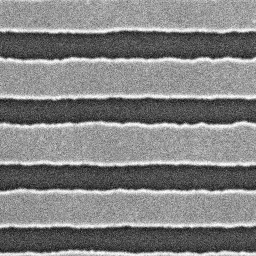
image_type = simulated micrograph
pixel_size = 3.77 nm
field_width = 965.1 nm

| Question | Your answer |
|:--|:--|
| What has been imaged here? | lines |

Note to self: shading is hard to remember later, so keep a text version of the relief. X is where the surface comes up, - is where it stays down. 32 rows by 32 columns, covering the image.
XXXXXXXXXXXXXXXXXXXXXXXXXXXXXXXX
XXXXXXXXXXXXXXXXXXXXXXXXXXXXXXXX
XXXXXXXXXXXXXXXXXXXXXXXXXXXXXXXX
XXXXXXXXXXXXXXXXXXXXXXXXXXXXXXXX
--------------------------------
--------------------------------
--------------------------------
XX------XXXXXXXXXXXXXXXXXXXXXX-X
XXXXXXXXXXXXXXXXXXXXXXXXXXXXXXXX
XXXXXXXXXXXXXXXXXXXXXXXXXXXXXXXX
XXXXXXXXXXXXXXXXXXXXXXXXXXXXXXXX
XXXXXXXXXXXXXXXXXXXXXXXXXXXXXXXX
--------------------------------
--------------------------------
--------------------------------
X-------X-XXXXX-XX--X--------XXX
XXXXXXXXXXXXXXXXXXXXXXXXXXXXXXXX
XXXXXXXXXXXXXXXXXXXXXXXXXXXXXXXX
XXXXXXXXXXXXXXXXXXXXXXXXXXXXXXXX
XXXXXXXXXXXXXXXXXXXXXXXXXXXXXXXX
X--XX-XXXX-XXXXXX-------XXXXXXXX
--------------------------------
--------------------------------
--------------------------------
XXXXXXXXXXXXXXXXXXXXXXXXXXXXXXXX
XXXXXXXXXXXXXXXXXXXXXXXXXXXXXXXX
XXXXXXXXXXXXXXXXXXXXXXXXXXXXXXXX
XXXXXXXXXXXXXXXXXXXXXXXXXXXXXXXX
--------------------------------
--------------------------------
--------------------------------
-------XXXXXX---------------X---